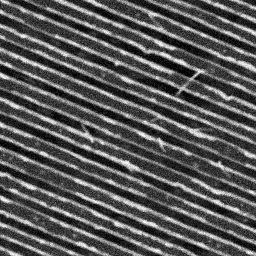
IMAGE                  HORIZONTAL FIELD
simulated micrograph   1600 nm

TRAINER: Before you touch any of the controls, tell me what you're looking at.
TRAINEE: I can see parallel lines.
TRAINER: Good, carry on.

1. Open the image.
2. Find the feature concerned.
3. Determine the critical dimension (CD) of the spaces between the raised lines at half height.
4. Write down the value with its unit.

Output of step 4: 0.0541 µm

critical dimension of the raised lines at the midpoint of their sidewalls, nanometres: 86.6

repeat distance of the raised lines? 143 nanometres